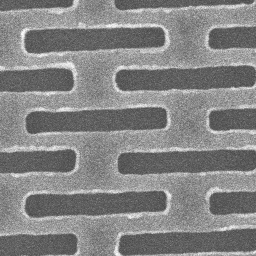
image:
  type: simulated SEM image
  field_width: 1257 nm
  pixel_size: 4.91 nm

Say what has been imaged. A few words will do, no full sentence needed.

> holes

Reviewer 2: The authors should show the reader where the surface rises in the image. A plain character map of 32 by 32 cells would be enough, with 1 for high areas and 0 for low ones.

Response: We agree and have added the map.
00000000011111000000000000000011
11111111111111111111111111111111
11111111111111111111111111111111
11111110111110000000111111110000
11100000000000000000011111000000
11100000000000000000111111000000
11100000111111111111111111111111
11111111111111111111111111111111
11111101111111111111101110000000
00000000011111000000000000000000
00000000011111100000000000000000
10010000111111111111111111111111
11111111111111111111111111111111
11111111111111110000111111111100
11100000000000000000011111000000
11100000000000000000011111000000
11110000000011111111111111111111
11111111111111111111111111111111
11111111111111111111111111111111
00000000011111100000000000000000
00000000011111100000000000000000
00000000011111100000000000111111
11111111111111111111111111111111
11111111111111111111111111111111
11110000000000000000011111000000
11100000000000000000011111000000
11100000000000000000111111000000
11111111111111111111111111111111
11111111111111111111111111111111
00000000011111100000000000000000
00000000001111100000000000000000
00000000001111100000000000100001